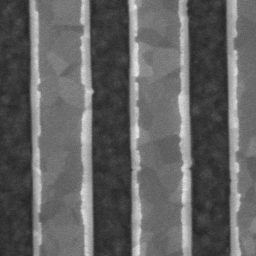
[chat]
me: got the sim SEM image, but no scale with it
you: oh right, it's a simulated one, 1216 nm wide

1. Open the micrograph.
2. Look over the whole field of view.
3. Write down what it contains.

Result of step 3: one or a few lines or trenches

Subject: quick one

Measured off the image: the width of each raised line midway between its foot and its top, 0.261 um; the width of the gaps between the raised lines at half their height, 208 nanometres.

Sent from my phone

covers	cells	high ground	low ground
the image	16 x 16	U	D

DDUUUDDDUUUUDDUU
DDUUUDDDUUUUDDUU
DDUUUDDDUUUUDDUU
DDUUUDDDUUUUDDUU
DDUUUDDDUUUUDDUU
DDUUUUDDUUUUDDUU
DDUUUUDDUUUUDDUU
DDUUUUDDUUUUDDUU
DDUUUUDDUUUUDDDU
DDUUUUDDUUUUDDDU
DDUUUUDDUUUUDDDU
DDUUUUDDUUUUDDDU
DDUUUUDDUUUUDDDU
DDUUUUDDUUUUDDDU
DDUUUUDDUUUUDDDU
DDUUUUDDUUUUDDDU